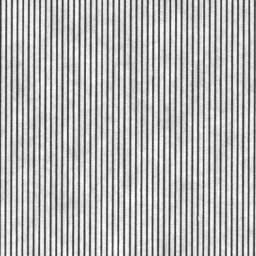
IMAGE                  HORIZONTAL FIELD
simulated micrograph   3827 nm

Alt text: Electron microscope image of parallel lines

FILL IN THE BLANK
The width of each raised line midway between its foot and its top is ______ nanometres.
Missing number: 59.8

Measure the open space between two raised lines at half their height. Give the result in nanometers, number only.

29.9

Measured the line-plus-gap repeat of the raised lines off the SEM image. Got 84.5 nm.